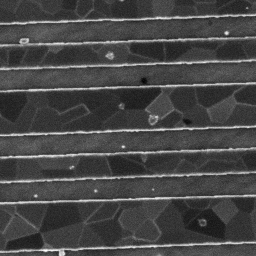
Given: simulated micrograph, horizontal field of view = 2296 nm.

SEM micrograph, lines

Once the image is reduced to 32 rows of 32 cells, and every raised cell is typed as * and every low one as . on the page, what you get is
********************************
********************************
*************.**................
................................
................................
..**....************************
********************************
********************************
***.............................
................................
...........................*****
********************************
********************************
********************************
********************************
********************************
************....................
................................
................................
.....***************************
********************************
********************************
*******.........................
................................
..............................**
********************************
********************************
********************************
********************************
********************************
****************************....
.......*........................